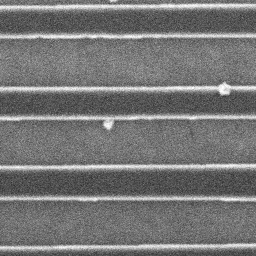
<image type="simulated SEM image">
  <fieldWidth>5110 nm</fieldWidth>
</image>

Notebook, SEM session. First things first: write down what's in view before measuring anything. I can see lines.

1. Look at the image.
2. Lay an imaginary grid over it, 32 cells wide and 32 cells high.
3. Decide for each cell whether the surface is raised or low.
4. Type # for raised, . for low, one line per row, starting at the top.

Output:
................................
################################
################################
################################
################################
................................
................................
................................
................................
................................
................................
################################
################################
################################
################################
................................
................................
................................
................................
................................
................................
################################
################################
################################
################################
................................
................................
................................
................................
................................
................................
################################